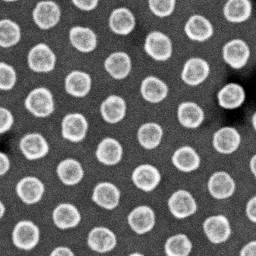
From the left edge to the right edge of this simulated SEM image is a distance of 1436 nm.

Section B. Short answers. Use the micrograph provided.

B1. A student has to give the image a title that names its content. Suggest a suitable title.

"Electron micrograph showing a regular array of raised bodies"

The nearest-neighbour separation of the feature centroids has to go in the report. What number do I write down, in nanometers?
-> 241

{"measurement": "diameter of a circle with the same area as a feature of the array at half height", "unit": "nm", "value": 140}